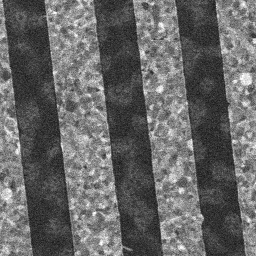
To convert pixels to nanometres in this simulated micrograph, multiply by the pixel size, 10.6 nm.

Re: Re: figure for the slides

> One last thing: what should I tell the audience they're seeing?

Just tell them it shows one or a few lines or trenches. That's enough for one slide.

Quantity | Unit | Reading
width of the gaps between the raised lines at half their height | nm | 432